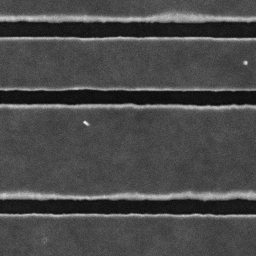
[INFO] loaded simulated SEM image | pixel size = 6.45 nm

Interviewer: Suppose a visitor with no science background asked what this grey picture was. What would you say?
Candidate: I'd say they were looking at lines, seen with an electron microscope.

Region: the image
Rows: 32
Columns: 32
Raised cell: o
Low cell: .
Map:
oooooooooooooooooooooooooooooooo
oooooooooooooooooooooooooooooooo
oooooooooooooooooooooooooooooooo
................................
................................
oooooooooooooooooooooooooooooooo
oooooooooooooooooooooooooooooooo
oooooooooooooooooooooooooooooooo
oooooooooooooooooooooooooooooooo
oooooooooooooooooooooooooooooooo
oooooooooooooooooooooooooooooooo
................................
................................
oooooooooooooooooooooooooooooooo
oooooooooooooooooooooooooooooooo
oooooooooooooooooooooooooooooooo
oooooooooooooooooooooooooooooooo
oooooooooooooooooooooooooooooooo
oooooooooooooooooooooooooooooooo
oooooooooooooooooooooooooooooooo
oooooooooooooooooooooooooooooooo
oooooooooooooooooooooooooooooooo
oooooooooooooooooooooooooooooooo
oooooooooooooooooooooooooooooooo
oooooooooooooooooooooooooooooooo
................................
................................
oooooooooooooooooooooooooooooooo
oooooooooooooooooooooooooooooooo
oooooooooooooooooooooooooooooooo
oooooooooooooooooooooooooooooooo
oooooooooooooooooooooooooooooooo